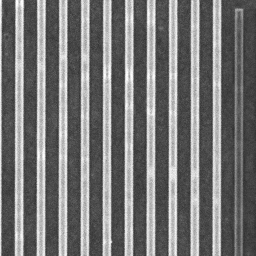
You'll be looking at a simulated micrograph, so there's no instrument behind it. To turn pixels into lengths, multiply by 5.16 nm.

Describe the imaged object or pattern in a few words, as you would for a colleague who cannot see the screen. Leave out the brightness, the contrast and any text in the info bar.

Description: parallel lines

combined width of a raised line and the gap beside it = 113 nanometres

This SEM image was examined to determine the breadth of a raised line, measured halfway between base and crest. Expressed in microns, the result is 0.0393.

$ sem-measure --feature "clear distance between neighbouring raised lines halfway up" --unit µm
0.0748